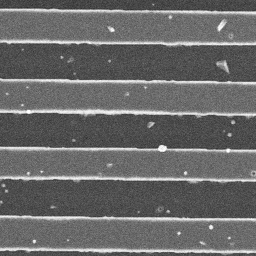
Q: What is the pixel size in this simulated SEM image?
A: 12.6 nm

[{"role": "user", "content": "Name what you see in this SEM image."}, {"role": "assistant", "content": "lines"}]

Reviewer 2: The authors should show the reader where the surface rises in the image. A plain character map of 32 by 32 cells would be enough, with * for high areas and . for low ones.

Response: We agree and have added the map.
................................
**************************......
********************************
********************************
********************************
.....................*...*******
................................
................................
................................
................................
********************************
********************************
********************************
********************************
................................
................................
................................
................................
******..............*...........
********************************
********************************
********************************
............................****
................................
................................
................................
................................
********************************
********************************
********************************
********************************
..........................******